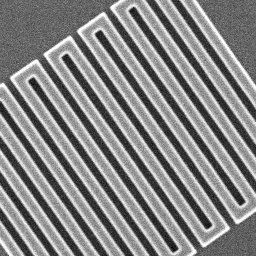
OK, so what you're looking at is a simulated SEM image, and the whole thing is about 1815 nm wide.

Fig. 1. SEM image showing groups of lines, slits or small figures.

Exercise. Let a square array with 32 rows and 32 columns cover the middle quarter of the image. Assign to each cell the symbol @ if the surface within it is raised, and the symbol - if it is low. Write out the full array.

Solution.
@--@@@@--@@@@---@@@---@@@@--@@@@
@---@@@@--@@@@---@@@---@@@---@@@
@@---@@@---@@@---@@@@--@@@@--@@@
@@@--@@@@--@@@@---@@@---@@@@--@@
@@@---@@@@--@@@@--@@@@---@@@---@
-@@@---@@@---@@@@--@@@@--@@@@---
-@@@@---@@@---@@@---@@@---@@@@--
--@@@---@@@@--@@@@---@@@---@@@--
---@@@---@@@---@@@---@@@@---@@@-
@--@@@@---@@@---@@@---@@@---@@@@
@---@@@@--@@@@---@@@---@@@---@@@
@@---@@@---@@@---@@@@--@@@@---@@
@@@--@@@@---@@@---@@@---@@@@--@@
@@@---@@@---@@@@--@@@@---@@@---@
@@@@---@@@---@@@@--@@@@--@@@@---
-@@@@---@@@---@@@---@@@---@@@@--
--@@@---@@@@--@@@@---@@@---@@@--
---@@@---@@@---@@@@--@@@@---@@@-
@--@@@@--@@@@---@@@---@@@@--@@@@
@---@@@@--@@@@---@@@---@@@---@@@
@@---@@@---@@@@--@@@@--@@@@---@@
@@@--@@@@---@@@---@@@@--@@@@--@@
@@@---@@@@--@@@@--@@@@---@@@---@
@@@@---@@@---@@@@--@@@@--@@@@---
-@@@@---@@@---@@@---@@@@--@@@@--
--@@@@--@@@@--@@@@---@@@---@@@@-
---@@@---@@@@--@@@@--@@@@---@@@-
@--@@@@---@@@---@@@---@@@@--@@@@
@---@@@@--@@@@---@@@---@@@---@@@
@@---@@@---@@@@--@@@@--@@@@---@@
@@@---@@@---@@@---@@@@--@@@@--@@
@@@@--@@@@--@@@@---@@@---@@@---@